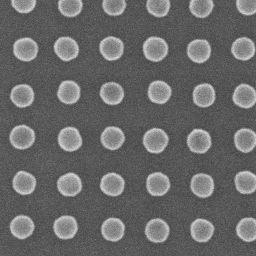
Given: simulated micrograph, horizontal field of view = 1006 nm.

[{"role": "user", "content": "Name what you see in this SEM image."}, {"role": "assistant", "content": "a regular array of raised bodies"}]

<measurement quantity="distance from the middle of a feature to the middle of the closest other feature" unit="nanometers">170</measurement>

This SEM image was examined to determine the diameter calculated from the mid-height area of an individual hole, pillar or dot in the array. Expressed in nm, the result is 90.8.